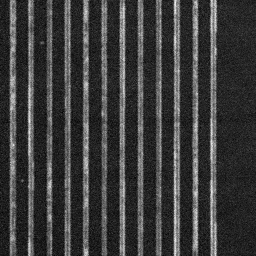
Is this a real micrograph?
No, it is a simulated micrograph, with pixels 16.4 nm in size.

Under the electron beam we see parallel lines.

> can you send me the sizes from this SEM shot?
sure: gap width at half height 234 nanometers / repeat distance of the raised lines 300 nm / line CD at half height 0.0596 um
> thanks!